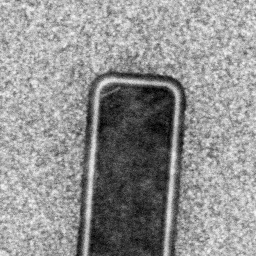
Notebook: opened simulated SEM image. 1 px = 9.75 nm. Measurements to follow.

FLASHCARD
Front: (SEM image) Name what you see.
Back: one or a few lines or trenches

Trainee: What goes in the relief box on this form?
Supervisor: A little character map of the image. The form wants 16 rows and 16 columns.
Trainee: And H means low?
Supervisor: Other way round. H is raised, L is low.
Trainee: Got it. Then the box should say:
LLLLLLLLLLLLLLLL
LLLLLLLLLLLLLLLL
LLLLLLLLLLLLLLLL
LLLLLLLLLLLLLLLL
LLLLLLLLLLLLLLLL
LLLLLLHHHHHLLLLL
LLLLLLHHHHHLLLLL
LLLLLLHHHHHLLLLL
LLLLLLHHHHHLLLLL
LLLLLLHHHHHLLLLL
LLLLLLHHHHHLLLLL
LLLLLLHHHHHLLLLL
LLLLLLHHHHHLLLLL
LLLLLLHHHHHLLLLL
LLLLLHHHHHLLLLLL
LLLLLHHHHHLLLLLL